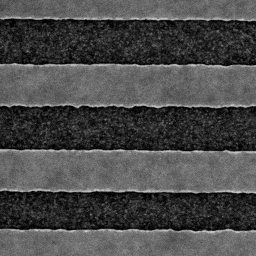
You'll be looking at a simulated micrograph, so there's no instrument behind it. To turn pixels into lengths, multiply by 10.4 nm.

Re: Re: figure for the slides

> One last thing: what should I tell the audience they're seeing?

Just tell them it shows lines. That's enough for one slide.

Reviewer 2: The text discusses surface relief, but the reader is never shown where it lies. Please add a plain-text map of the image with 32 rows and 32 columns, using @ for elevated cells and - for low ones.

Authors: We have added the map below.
@@@@@@@@@@@@@@@@@@@@@@@@@@@@@@@@
@@@@@@@@@@@@@@@@@@@@@@@@@@@@@@@@
-------------------@-@-@-@@@@@@@
--------------------------------
--------------------------------
--------------------------------
--------------------------------
--------------------------------
@@@@@@@@@@@@@@@@@@@@@@@@@@@@@@@@
@@@@@@@@@@@@@@@@@@@@@@@@@@@@@@@@
@@@@@@@@@@@@@@@@@@@@@@@@@@@@@@@@
@@@@@@@@@@@@@@@@@@@@@@@@@@@@@@@@
@@@@@@@@@@@@@@@@@@@@@@@@@@@@@@@@
--------------------------------
--------------------------------
--------------------------------
--------------------------------
--------------------------------
--------------------------------
@@@@@@@@@@@@@@@@@@@@@@@@@@@@@@@@
@@@@@@@@@@@@@@@@@@@@@@@@@@@@@@@@
@@@@@@@@@@@@@@@@@@@@@@@@@@@@@@@@
@@@@@@@@@@@@@@@@@@@@@@@@@@@@@@@@
@@@@@@@@@@@@@@@@@@@@@@@@@@@@@@@@
--------------------------------
--------------------------------
--------------------------------
--------------------------------
--------------------------------
@@@@@@@@@@@@@@@@@@@@@@@@@@@@@@@@
@@@@@@@@@@@@@@@@@@@@@@@@@@@@@@@@
@@@@@@@@@@@@@@@@@@@@@@@@@@@@@@@@